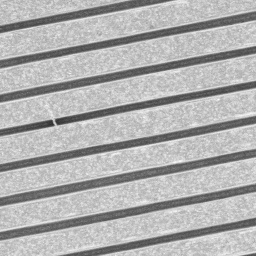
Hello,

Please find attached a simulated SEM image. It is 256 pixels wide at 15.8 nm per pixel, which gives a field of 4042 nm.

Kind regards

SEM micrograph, parallel lines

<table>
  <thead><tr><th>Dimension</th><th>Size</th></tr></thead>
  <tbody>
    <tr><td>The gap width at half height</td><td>8.11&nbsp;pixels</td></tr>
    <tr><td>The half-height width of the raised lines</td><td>401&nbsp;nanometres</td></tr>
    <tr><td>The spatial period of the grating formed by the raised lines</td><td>535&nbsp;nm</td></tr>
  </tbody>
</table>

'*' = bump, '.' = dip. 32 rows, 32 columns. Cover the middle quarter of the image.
********************............
***************...........******
*********............***********
****.............***************
............********************
......**************************
.*******************************
*****************************...
************************........
*******************..........***
*************...........********
********..........**************
****.........*******************
.........***********************
....****************************
********************************
*****************************...
************************........
*******************...........**
*************............*******
********...........*************
**............******************
.........***********************
....****************************
*******************************.
************************........
*******************.............
**************.............*****
********..............**********
***..............***************
............********************
......**************************